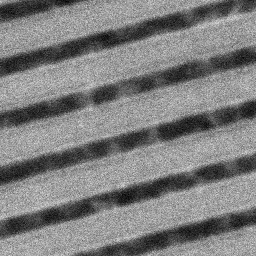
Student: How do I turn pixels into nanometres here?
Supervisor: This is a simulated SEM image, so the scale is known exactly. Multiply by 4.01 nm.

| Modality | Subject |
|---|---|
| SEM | parallel lines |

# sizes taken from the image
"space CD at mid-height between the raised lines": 27.5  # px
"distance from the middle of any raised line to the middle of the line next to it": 208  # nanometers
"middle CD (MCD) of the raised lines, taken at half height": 0.0993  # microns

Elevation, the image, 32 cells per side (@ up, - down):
@@@@@@@@@@@-------------@@@@@@@@
@@@@@@@--------------@@@@@@@@@@@
@@@--------------@@@@@@@@@@@@---
-------------@@@@@@@@@@@@-------
---------@@@@@@@@@@@@-----------
------@@@@@@@@@@@@-------------@
--@@@@@@@@@@@@-------------@@@@@
@@@@@@@@@@-------------@@@@@@@@@
@@@@@@--------------@@@@@@@@@@@-
@@--------------@@@@@@@@@@@-----
------------@@@@@@@@@@@@--------
--------@@@@@@@@@@@@------------
----@@@@@@@@@@@@--------------@@
-@@@@@@@@@@@--------------@@@@@@
@@@@@@@@@-------------@@@@@@@@@@
@@@@@-------------@@@@@@@@@@@@--
@--------------@@@@@@@@@@@@-----
-----------@@@@@@@@@@@@---------
-------@@@@@@@@@@@@-------------
---@@@@@@@@@@@@--------------@@@
@@@@@@@@@@@@-------------@@@@@@@
@@@@@@@@-------------@@@@@@@@@@@
@@@@-------------@@@@@@@@@@@@@--
-------------@@@@@@@@@@@@@------
----------@@@@@@@@@@@@----------
------@@@@@@@@@@@@-------------@
--@@@@@@@@@@@@--------------@@@@
@@@@@@@@@@@-------------@@@@@@@@
@@@@@@@-------------@@@@@@@@@@@@
@@@-------------@@@@@@@@@@@@----
------------@@@@@@@@@@@@--------
---------@@@@@@@@@@@@-----------